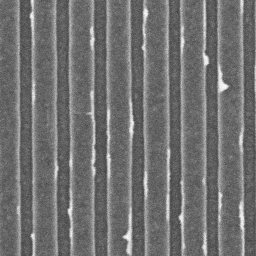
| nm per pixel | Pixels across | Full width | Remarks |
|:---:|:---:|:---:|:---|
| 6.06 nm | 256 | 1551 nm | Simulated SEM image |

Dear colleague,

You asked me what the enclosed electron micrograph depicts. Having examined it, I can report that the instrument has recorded parallel lines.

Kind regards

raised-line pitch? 226 nm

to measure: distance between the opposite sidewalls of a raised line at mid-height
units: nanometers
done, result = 152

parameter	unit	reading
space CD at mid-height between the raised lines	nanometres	72.7